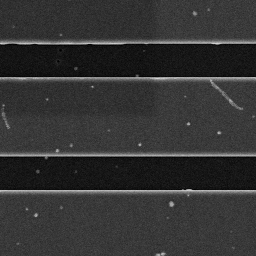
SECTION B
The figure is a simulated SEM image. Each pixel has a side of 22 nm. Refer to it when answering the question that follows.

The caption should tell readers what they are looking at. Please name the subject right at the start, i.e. lines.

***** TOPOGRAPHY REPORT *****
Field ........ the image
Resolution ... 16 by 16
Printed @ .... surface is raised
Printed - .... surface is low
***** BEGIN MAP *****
@@@@@@@@@@@@@@@@
@@@@@@@@@@@@@@@@
@@@@@@@@@@@@@@@@
----------------
----------------
@@@@@@@@@@@@@@@@
@@@@@@@@@@@@@@@@
@@@@@@@@@@@@@@@@
@@@@@@@@@@@@@@@@
@@@@@@@@@@@@@@@@
----------------
----------------
@@@@@@@@@@@@@@@@
@@@@@@@@@@@@@@@@
@@@@@@@@@@@@@@@@
@@@@@@@@@@@@@@@@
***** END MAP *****